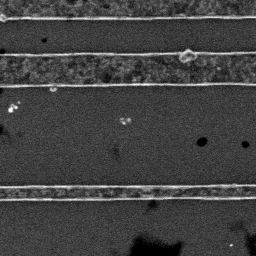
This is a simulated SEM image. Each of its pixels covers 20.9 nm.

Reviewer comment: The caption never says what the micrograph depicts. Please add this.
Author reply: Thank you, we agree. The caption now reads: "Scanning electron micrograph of wiring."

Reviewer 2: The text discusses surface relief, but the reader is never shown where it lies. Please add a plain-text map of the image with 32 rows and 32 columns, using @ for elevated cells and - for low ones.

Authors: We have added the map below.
@@@@@@@@@@@@@@@@@@@@@@@@@@@@@@@@
@@@@@@@@@@@@@@@@@@@@@@@@@@@@@@@@
@-------------------------------
--------------------------------
--------------------------------
--------------------------------
-----------------------@--------
@@@@@@@@@@@@@@@@@@@@@@@@@@@@@@@@
@@@@@@@@@@@@@@@@@@@@@@@@@@@@@@@@
@@@@@@@@@@@@@@@@@@@@@@@@@@@@@@@@
@@@@@@@@@@@@@@@@@@@@@@@@@@@---@@
--------------------------------
--------------------------------
--------------------------------
--------------------------------
--------------------------------
--------------------------------
--------------------------------
--------------------------------
--------------------------------
--------------------------------
--------------------------------
--------------------------------
@@@@@@@@@@@@@@@@@@@@@@@@@@@@@@@@
@@@@@@@@@@@@@@@@@@@@@@@@@@@@@@@@
--------------------------------
--------------------------------
--------------------------------
--------------------------------
--------------------------------
--------------------------------
--------------------------------